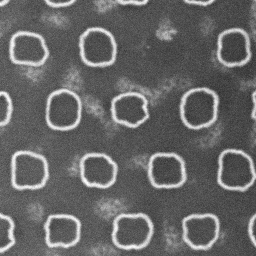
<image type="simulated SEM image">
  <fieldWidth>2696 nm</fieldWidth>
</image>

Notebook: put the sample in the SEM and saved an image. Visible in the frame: a regular array of raised bodies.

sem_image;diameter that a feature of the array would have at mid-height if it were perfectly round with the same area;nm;372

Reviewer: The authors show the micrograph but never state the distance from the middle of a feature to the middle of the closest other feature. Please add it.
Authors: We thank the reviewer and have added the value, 726 nm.